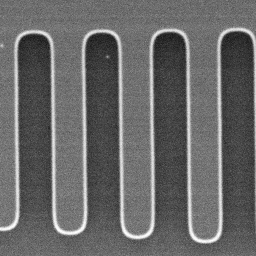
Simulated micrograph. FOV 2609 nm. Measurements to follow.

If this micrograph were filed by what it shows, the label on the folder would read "groups of lines, slits or small figures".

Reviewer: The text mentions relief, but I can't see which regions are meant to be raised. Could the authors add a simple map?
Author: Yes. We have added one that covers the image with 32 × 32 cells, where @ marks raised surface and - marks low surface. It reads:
@@@@@@@@@@@@@@@@@@@@@@@@@@@@@@@@
@@@@@@@@@@@@@@@@@@@@@@@@@@@@@@@@
@@@@@@@@@@@@@@@@@@@@@@@@@@@@@@@@
@@@@@@@@@@@@@@@@@@@@@@@@@@@@@@@@
@@@---@@@@@---@@@@@----@@@@@---@
@@----@@@@@----@@@@----@@@@-----
@@-----@@@-----@@@@----@@@@-----
@@-----@@@-----@@@@----@@@@-----
@@-----@@@-----@@@@----@@@@-----
@@-----@@@-----@@@@-----@@@-----
@@-----@@@-----@@@@-----@@@-----
@@-----@@@-----@@@@-----@@@-----
@@-----@@@@----@@@@-----@@@-----
@@-----@@@@----@@@@-----@@@-----
@@-----@@@@----@@@@-----@@@-----
@@-----@@@@----@@@@-----@@@-----
@@-----@@@@----@@@@-----@@@-----
@@-----@@@@----@@@@-----@@@-----
@@-----@@@@----@@@@-----@@@-----
@@-----@@@@----@@@@-----@@@-----
@@-----@@@@----@@@@-----@@@-----
@@-----@@@@----@@@@-----@@@@----
@@-----@@@@----@@@@-----@@@@----
@@-----@@@@----@@@@-----@@@@----
@@-----@@@@----@@@@-----@@@@----
@@-----@@@@----@@@@-----@@@@----
@@-----@@@@----@@@@-----@@@@----
@@-----@@@@----@@@@-----@@@@----
@------@@@-----@@@@-----@@@@----
----------------@@------@@@-----
--------------------------------
--------------------------------